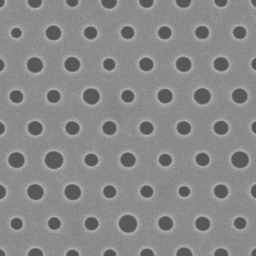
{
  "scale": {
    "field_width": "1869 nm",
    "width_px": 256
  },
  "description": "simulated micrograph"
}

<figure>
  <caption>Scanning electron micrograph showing a regular array of holes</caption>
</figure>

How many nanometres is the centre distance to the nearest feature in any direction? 267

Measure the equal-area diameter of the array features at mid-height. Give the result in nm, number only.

102